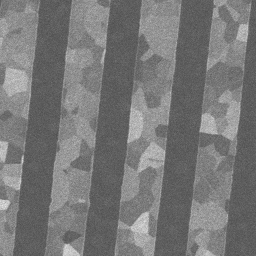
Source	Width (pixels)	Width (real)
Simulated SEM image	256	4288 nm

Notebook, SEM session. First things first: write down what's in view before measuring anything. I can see one or a few lines or trenches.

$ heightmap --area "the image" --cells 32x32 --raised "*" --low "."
*****....*****....*****....****.
*****....*****....*****....****.
*****....*****....****.....****.
*****....****....*****....*****.
*****....****....*****....*****.
****.....****....*****....*****.
****....*****....*****....*****.
****....*****....*****....*****.
****....*****....*****....****..
****....*****....*****....****..
****....*****....*****....****..
****....*****....****.....****..
****....****.....****....*****..
****....****....*****....*****..
***.....****....*****....*****..
***.....****....*****....*****..
***....*****....*****....*****..
***....*****....*****....*****..
***....*****....*****....*****..
***....*****....*****....****...
***....*****....****.....****...
***....****.....****....*****...
***....****....*****....*****...
**.....****....*****....*****...
**....*****....*****....*****...
**....*****....*****....*****...
**....*****....*****....*****...
**....*****....*****....****....
**....*****....*****....****....
**....*****....****.....****....
**....****.....****....*****....
**....****....*****....*****....